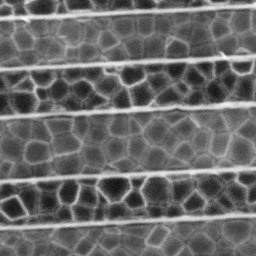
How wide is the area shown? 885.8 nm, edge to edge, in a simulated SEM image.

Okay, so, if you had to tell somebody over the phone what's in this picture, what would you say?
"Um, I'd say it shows one or a few lines or trenches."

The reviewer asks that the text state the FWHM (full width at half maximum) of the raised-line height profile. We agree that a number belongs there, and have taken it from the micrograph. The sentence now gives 47.5 px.